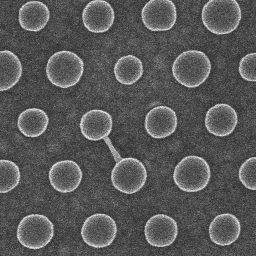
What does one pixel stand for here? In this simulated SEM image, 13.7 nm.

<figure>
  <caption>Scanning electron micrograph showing a regular array of raised bodies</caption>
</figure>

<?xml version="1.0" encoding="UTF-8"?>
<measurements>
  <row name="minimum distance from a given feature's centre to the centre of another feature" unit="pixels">61.5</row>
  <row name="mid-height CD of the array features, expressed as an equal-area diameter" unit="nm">434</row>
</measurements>